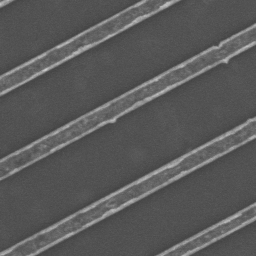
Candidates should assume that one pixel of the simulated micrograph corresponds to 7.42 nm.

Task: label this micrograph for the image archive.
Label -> one or a few lines or trenches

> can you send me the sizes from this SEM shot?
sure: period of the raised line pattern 582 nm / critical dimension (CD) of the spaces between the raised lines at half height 443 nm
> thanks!